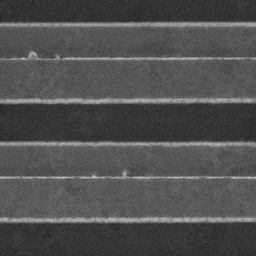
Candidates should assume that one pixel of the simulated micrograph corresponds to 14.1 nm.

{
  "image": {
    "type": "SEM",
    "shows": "lines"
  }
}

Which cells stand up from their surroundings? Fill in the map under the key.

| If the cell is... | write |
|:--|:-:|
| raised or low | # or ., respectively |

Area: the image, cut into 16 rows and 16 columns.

................
................
################
################
################
################
................
................
................
################
################
################
################
################
................
................